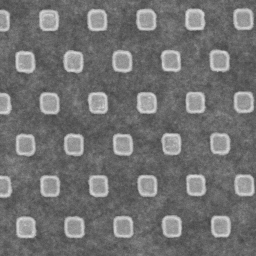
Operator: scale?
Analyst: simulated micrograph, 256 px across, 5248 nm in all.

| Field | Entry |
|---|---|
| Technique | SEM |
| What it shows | a regular array of raised bodies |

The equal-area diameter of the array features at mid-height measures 418 nanometres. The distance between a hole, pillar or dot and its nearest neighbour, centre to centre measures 978 nanometers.